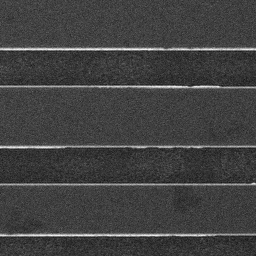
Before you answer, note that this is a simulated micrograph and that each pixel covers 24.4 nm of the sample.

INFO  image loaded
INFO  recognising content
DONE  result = lines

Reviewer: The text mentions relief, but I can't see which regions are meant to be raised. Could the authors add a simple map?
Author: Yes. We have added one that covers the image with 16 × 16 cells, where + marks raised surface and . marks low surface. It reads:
++++++++++++++++
++++++++++++++++
++++++++++++++++
................
................
++++++++++++++++
++++++++++++++++
++++++++++++++++
++++++++++++++++
................
................
...............+
++++++++++++++++
++++++++++++++++
++++++++++++++++
................